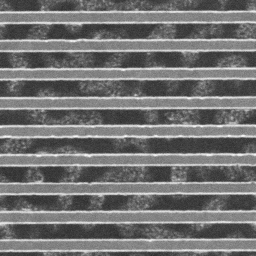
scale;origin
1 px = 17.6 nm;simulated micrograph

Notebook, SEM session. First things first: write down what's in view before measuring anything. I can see parallel lines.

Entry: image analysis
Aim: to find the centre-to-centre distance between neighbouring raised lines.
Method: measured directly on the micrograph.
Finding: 501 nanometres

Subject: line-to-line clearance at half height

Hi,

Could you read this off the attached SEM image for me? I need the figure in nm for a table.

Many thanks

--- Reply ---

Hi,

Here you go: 187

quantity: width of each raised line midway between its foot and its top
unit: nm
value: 320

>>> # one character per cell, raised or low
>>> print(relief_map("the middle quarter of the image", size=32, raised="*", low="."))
********************************
................................
................................
................................
********************************
********************************
********************************
********************************
...****.........................
................................
................................
********************************
********************************
********************************
********************************
*********.......................
................................
................................
********************************
********************************
********************************
********************************
**************.**..**.****...***
................................
................................
********************************
********************************
********************************
*******************.************
********************************
................................
................................